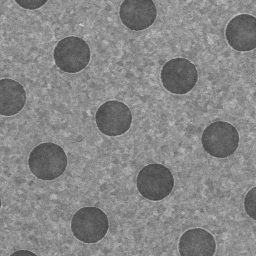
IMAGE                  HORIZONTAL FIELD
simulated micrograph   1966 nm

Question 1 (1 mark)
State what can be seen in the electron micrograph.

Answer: holes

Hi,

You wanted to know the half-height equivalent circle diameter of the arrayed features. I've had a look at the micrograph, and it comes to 0.29 µm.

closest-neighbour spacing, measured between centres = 583 nanometers